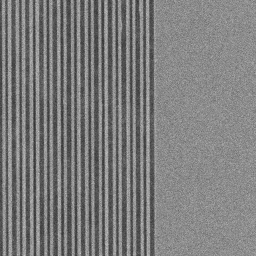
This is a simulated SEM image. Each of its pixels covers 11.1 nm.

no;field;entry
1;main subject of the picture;parallel lines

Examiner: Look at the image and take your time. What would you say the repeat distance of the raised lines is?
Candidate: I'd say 76.4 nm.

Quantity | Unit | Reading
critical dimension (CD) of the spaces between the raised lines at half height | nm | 51.5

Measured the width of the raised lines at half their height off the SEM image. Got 32 nanometers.